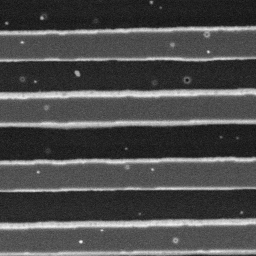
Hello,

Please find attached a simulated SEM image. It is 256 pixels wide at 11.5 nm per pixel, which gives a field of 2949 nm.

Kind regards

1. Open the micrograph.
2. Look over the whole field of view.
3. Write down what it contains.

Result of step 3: lines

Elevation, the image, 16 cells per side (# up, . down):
................
................
################
################
................
................
################
################
................
................
################
################
................
................
################
################